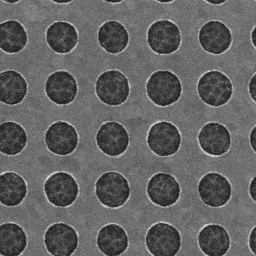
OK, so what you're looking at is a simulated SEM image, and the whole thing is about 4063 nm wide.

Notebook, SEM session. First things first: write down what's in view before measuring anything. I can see a regular array of holes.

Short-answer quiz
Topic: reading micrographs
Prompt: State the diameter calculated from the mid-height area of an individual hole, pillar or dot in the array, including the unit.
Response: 536 nm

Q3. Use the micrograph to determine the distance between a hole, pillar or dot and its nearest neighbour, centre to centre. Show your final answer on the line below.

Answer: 804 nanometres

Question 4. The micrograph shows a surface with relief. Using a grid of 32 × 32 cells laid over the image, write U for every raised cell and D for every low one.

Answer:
UUUUUUUUUUUUUUUUUUUUUUUUUUUUUUUU
UUUUUUUUUUUUUUUUUUUUUUUUUUUUUUUU
UUUUUUUUUUUUUUUUUUUUDUUUUUUUUUUU
DDDUUUDDDUUUUDDDUUUDDDUUUDDDUUUU
DDDUUUDDDDUUDDDDUUDDDDDUUDDDDUUD
DDDUUUDDDDUUDDDDUUUDDDDUUDDDDUUU
UDUUUUUDDUUUUUDUUUUDDDUUUUDDUUUU
UUUUUUUUUUUUUUUUUUUUUUUUUUUUUUUU
UUUUUUUUUUUUUUUUUUUUUUUUUUUUUUUU
DDDUUUDDDUUUDDDDUUUDDDUUUDDDUUUU
DDDUUUDDDDUUDDDDUUDDDDDUUDDDDUUD
DDDUUUDDDDUUDDDDUUDDDDDUUDDDDUUD
DDDUUUDDDUUUUDDDUUUDDDUUUDDDDUUU
UUUUUUUUUUUUUUUUUUUUUUUUUUUUUUUU
UUUUUUUUUUUUUUUUUUUUUUUUUUUUUUUU
DDUUUUUDDUUUUDDUUUUDDDUUUUDDUUUU
DDDUUUDDDDUUDDDDUUUDDDUUUDDDDUUD
DDDUUUDDDDUUDDDDUUDDDDDUUDDDDUUD
DDDUUUDDDUUUDDDDUUUDDDUUUDDDDUUU
UUUUUUUUUUUUUUUUUUUUDUUUUUUUUUUU
UUUUUUUUUUUUUUUUUUUUUUUUUUUUUUUU
UUUUUUUUUUUUUUUUUUUUUUUUUUUUUUUU
DDDUUUDDDUUUDDDDUUUDDDUUUDDDUUUU
DDDUUUDDDDUUDDDDUUDDDDUUUDDDDUUD
DDDUUUDDDDUUDDDDUUDDDDUUUDDDDUUD
DDUUUUUDDUUUUDDUUUUUDDUUUUDDUUUU
UUUUUUUUUUUUUUUUUUUUUUUUUUUUUUUU
UUUUUUUUUUUUUUUUUUUUUUUUUUUUUUUU
DDDUUUDDDUUUUDDUUUUDDDUUUDDDUUUU
DDDUUUDDDDUUDDDDUUDDDDDUUDDDDUUD
DDDUUUDDDDUUDDDDUUDDDDDUUDDDDUUD
DDDUUUDDDUUUUDDUUUUDDDUUUDDDUUUU